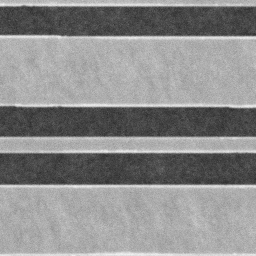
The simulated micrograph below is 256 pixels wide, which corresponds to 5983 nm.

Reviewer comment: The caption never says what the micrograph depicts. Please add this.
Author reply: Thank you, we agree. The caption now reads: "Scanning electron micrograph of lines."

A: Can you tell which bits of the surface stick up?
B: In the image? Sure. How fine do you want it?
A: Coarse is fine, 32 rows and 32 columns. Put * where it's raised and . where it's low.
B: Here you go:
********************************
................................
................................
................................
................................
********************************
********************************
********************************
********************************
********************************
********************************
********************************
********************************
................................
................................
................................
................................
********************************
********************************
................................
................................
................................
................................
********************************
********************************
********************************
********************************
********************************
********************************
********************************
********************************
********************************